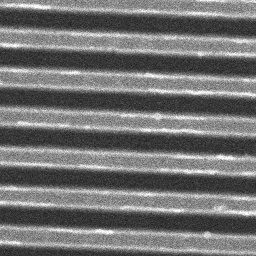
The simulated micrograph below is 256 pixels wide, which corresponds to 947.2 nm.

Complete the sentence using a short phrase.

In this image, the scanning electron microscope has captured parallel lines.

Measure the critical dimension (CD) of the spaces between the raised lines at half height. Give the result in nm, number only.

67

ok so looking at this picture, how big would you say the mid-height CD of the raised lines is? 77.7 nm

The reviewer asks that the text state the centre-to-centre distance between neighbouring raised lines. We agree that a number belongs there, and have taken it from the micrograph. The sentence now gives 146 nm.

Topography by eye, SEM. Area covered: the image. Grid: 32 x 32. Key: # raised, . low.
################################
..........######################
................................
##..............................
##########################......
################################
.............###################
................................
####............................
############################....
################################
...............#################
................................
####............................
############################....
################################
................################
................................
######..........................
###############################.
################################
.................###############
................................
#########.......................
################################
################################
..................##############
................................
########........................
################################
################################
...................#############